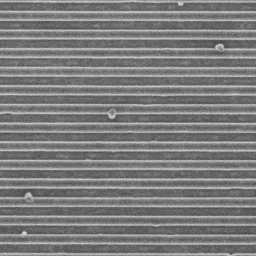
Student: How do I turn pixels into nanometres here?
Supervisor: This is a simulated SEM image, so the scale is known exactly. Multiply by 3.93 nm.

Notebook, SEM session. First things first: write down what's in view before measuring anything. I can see parallel lines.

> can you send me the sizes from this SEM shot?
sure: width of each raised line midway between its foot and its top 36.8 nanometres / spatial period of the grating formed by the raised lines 0.0731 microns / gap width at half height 0.0373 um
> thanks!